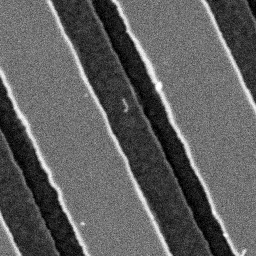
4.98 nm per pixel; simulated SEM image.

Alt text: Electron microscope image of lines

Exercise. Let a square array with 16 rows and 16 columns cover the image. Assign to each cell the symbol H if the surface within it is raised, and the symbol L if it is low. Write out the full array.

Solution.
HHHLLLLHHHHHHLLL
HHHHLLLLHHHHHHLL
HHHHLLLLHHHHHHLL
HHHHHLLLLHHHHHHL
HHHHHLLLLHHHHHHL
HHHHHHLLLLHHHHHL
LHHHHHLLLLHHHHHH
LHHHHHHLLLLHHHHH
LLHHHHHLLLLHHHHH
LLHHHHHHLLLLHHHH
LLLHHHHHLLLLHHHH
LLLHHHHHHLLLLHHH
LLLLHHHHHLLLLHHH
LLLLHHHHHHLLLHHH
HLLLLHHHHHLLLLHH
HLLLLHHHHHHLLLHH